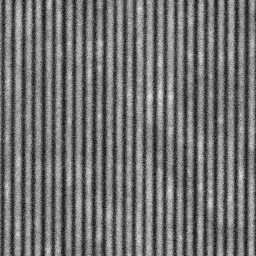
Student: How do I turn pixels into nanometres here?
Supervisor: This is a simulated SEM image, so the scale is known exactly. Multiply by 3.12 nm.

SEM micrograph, parallel lines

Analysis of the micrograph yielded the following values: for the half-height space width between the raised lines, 0.0176 microns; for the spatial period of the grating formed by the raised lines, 31.8 nm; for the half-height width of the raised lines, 14.8 nanometers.